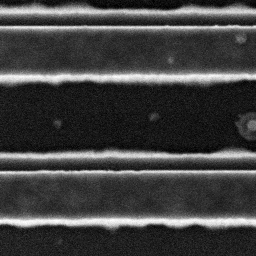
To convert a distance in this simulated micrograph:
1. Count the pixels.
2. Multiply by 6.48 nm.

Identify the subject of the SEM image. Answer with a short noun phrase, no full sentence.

lines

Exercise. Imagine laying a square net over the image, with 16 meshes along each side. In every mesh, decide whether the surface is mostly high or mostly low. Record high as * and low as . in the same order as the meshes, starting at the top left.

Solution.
................
****************
****************
****************
****************
................
................
................
................
................
****************
****************
****************
****************
................
................